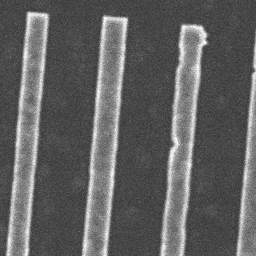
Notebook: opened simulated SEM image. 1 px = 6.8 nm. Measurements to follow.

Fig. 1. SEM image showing one or a few lines or trenches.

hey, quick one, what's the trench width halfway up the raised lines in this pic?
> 0.385 microns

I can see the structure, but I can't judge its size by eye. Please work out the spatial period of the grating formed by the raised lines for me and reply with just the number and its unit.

526 nm